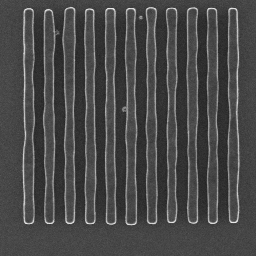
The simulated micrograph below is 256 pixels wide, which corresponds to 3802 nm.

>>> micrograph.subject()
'groups of lines, slits or small figures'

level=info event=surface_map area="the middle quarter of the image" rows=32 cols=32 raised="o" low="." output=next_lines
ooo..ooo..ooo...oo...oo...oo...o
ooo..ooo..ooo...oo...oo...oo...o
ooo..oo....o....oo...oo...oo...o
ooo..oo....o....oo...oo...oo...o
ooo..oo....o....oo...oo...oo...o
ooo..oo....o....oo...oo...oo...o
ooo..oo....oo...oo...oo...oo...o
ooo..oo....oo...oo...oo...oo...o
ooo..oo....oo...oo...oo...oo...o
.oo...o....oo...oo...oo...oo...o
.o....o...ooo...oo...oo...oo...o
.o....oo..ooo...oo...oo...oo...o
.o...ooo..ooo...oo...oo...oo...o
.o...oo...ooo...oo...oo...oo...o
.oo..ooo...oo...oo...oo...oo...o
.oo..ooo...oo...oo...oo...oo...o
oo...ooo...oo...oo...oo...oo...o
oo...ooo...oo...oo...oo...oo...o
ooo...oo...oo...oo...oo...oo...o
ooo..ooo...oo...oo...oo...oo...o
ooo..ooo...oo...oo...oo...oo...o
ooo..ooo..ooo...oo...oo...oo...o
ooo..ooo..ooo...oo...oo...oo...o
.oo..ooo..ooo...oo...oo...oo...o
.oo...oo..ooo...oo...oo...oo...o
ooo...oo..ooo...oo...oo...oo...o
ooo..ooo..ooo...oo...oo...oo...o
ooo..ooo..ooo...oo...oo...oo...o
ooo..ooo...oo...oo...oo...oo...o
ooo..ooo...oo...oo...oo...oo...o
.oo..ooo...oo...oo...oo...oo...o
ooo..ooo...oo...oo...oo...oo...o